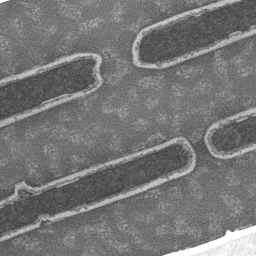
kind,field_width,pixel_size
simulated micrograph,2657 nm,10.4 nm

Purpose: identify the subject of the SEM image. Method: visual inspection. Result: one or a few lines or trenches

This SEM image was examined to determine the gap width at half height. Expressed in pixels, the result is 75.4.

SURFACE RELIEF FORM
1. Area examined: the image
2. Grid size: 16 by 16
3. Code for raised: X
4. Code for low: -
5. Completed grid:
-------------XXX
----------XXXXXX
---------XXXXX--
-----X--XXXX----
--XXXX----------
XXXXXX----------
XXX-------------
X-------------XX
-------------XXX
---------XXX-XX-
------XXXXXX----
---XXXXXXX------
-XXXXXX---------
XXXX------------
X--------------X
------------XXXX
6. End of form